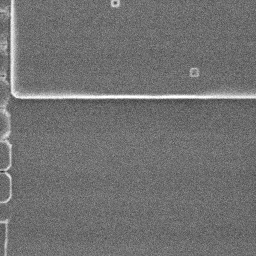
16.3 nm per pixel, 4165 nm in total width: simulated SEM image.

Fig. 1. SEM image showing wiring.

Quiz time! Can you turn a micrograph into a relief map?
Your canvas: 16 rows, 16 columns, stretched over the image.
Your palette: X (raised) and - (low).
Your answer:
-XXXXXXXXXXXXXXX
-XXXXXXXXXXXXXXX
-XXXXXXXXXXXXXXX
-XXXXXXXXXXXXXXX
-XXXXXXXXXXXXXXX
-XXXXXXXXXXXXXXX
----------------
----------------
----------------
----------------
----------------
----------------
----------------
----------------
----------------
----------------